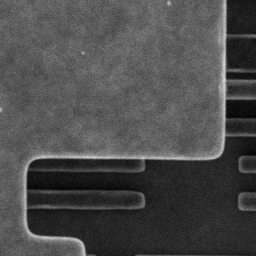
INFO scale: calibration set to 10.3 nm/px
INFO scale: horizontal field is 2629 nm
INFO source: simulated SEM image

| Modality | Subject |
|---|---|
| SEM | wiring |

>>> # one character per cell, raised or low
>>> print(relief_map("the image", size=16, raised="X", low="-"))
XXXXXXXXXXXXXX--
XXXXXXXXXXXXXX--
XXXXXXXXXXXXXX--
XXXXXXXXXXXXXX--
XXXXXXXXXXXXXX--
XXXXXXXXXXXXXXXX
XXXXXXXXXXXXXX--
XXXXXXXXXXXXXX--
XXXXXXXXXXXXXX--
XXXXXXXXXXXXXX--
XX--------------
XX--------------
XX--------------
XX--------------
XX--------------
XXXXX-----------